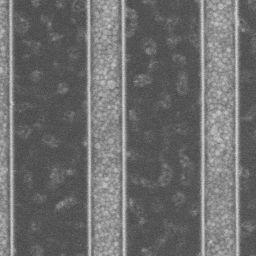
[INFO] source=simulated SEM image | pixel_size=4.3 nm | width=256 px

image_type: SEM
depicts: one or a few lines or trenches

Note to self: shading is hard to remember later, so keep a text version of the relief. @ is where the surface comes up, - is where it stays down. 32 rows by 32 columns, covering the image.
-@@@@@@@@@@----@@@@@@@@@@----@@@
-@@@@@@@@@@----@@@@@@@@@@----@@@
-@@@@@@@@@@----@@@@@@@@@@----@@@
-@@@@@@@@@@----@@@@@@@@@@----@@@
-@@@@@@@@@@----@@@@@@@@@@-----@@
-@@@@@@@@@@----@@@@@@@@@@-----@@
-@@@@@@@@@@----@@@@@@@@@@-----@@
-@@@@@@@@@@----@@@@@@@@@@-----@@
-@@@@@@@@@@----@@@@@@@@@@-----@@
-@@@@@@@@@@----@@@@@@@@@@-----@@
-@@@@@@@@@@----@@@@@@@@@@-----@@
-@@@@@@@@@@----@@@@@@@@@@-----@@
-@@@@@@@@@@----@@@@@@@@@@-----@@
-@@@@@@@@@@----@@@@@@@@@@-----@@
-@@@@@@@@@@----@@@@@@@@@@-----@@
-@@@@@@@@@@----@@@@@@@@@@-----@@
-@@@@@@@@@@----@@@@@@@@@@-----@@
-@@@@@@@@@@----@@@@@@@@@@-----@@
-@@@@@@@@@@----@@@@@@@@@@-----@@
-@@@@@@@@@@----@@@@@@@@@@-----@@
-@@@@@@@@@@----@@@@@@@@@@-----@@
-@@@@@@@@@@----@@@@@@@@@@-----@@
-@@@@@@@@@@----@@@@@@@@@@-----@@
-@@@@@@@@@@----@@@@@@@@@@-----@@
-@@@@@@@@@@----@@@@@@@@@@-----@@
-@@@@@@@@@@----@@@@@@@@@@-----@@
-@@@@@@@@@@----@@@@@@@@@@-----@@
-@@@@@@@@@@----@@@@@@@@@@-----@@
-@@@@@@@@@@----@@@@@@@@@@-----@@
-@@@@@@@@@@----@@@@@@@@@@-----@@
-@@@@@@@@@@----@@@@@@@@@@-----@@
-@@@@@@@@@@----@@@@@@@@@@-----@@